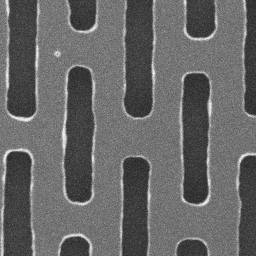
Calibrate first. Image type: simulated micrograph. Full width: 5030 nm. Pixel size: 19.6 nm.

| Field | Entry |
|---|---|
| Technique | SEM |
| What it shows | holes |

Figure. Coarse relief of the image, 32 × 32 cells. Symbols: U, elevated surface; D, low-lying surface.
UDDDDUUUUDDDUUUUDDDUUUUDDDDUUUUD
UDDDDUUUUDDDUUUUDDDUUUUDDDDUUUUD
UDDDDUUUUDDDUUUUDDDUUUUDDDDUUUUD
UDDDDUUUUDDDUUUUDDDUUUUDDDDUUUUD
UDDDDUUUUUUUUUUDDDDUUUUUDDUUUUUD
UDDDDUUUUUUUUUUUDDDUUUUUUUUUUUUD
UDDDDUUUUUUUUUUUDDDUUUUUUUUUUUDD
UDDDUUUUUUUUUUUUDDDUUUUUUUUUUUDD
UDDDUUUUUDDUUUUUDDDUUUUUUUUUUUUD
UDDDUUUUUDDUUUUUDDDUUUUDDDUUUUUD
UDDDDUUUDDDDUUUUDDDUUUUDDDUUUUUD
UDDDDUUUDDDDUUUUDDDUUUUDDDUUUUUD
UDDDDUUUDDDDUUUDDDDUUUUDDDUUUUDD
UDDDDUUUDDDDUUUDDDDUUUUDDDUUUUUD
UUDDUUUUDDDDUUUUDDUUUUUDDDUUUUUU
UUUUUUUUDDDDUUUUUUUUUUUDDDUUUUUU
UUUUUUUUDDDDUUUUUUUUUUUDDDUUUUUU
UUUUUUUUDDDDUUUUUUUUUUUDDDUUUUUU
UUUUUUUUDDDDUUUUUUUUUUUDDDUUUUUU
UDDDUUUUDDDDUUUUUUUUUUUDDDUUUUUD
UDDDUUUUDDDDUUUDDDDUUUUDDDUUUUDD
UDDDUUUUDDDDUUUDDDDUUUUDDDUUUUDD
UDDDUUUUDDDDUUUDDDDUUUUDDDUUUUDD
UDDDUUUUDDDDUUUDDDDUUUUDDDUUUUDD
UDDDUUUUDDDUUUUDDDUUUUUDDDUUUUDD
DDDDUUUUUUUUUUUDDDUUUUUUDUUUUUDD
DDDDUUUUUUUUUUUDDDDUUUUUUUUUUUDD
DDDDUUUUUUUUUUUDDDUUUUUUUUUUUUDD
DDDDUUUUUUUUUUUDDDDUUUUUUUUUUUDD
DDDDUUUUUDUUUUUDDDDUUUUUUUUUUUDD
DDDDUUUUDDDUUUUDDDDUUUDDDDUUUUDD
DDDDUUUDDDDUUUUDDDUUUUDDDDUUUUDD